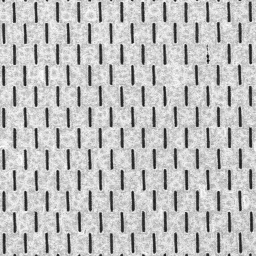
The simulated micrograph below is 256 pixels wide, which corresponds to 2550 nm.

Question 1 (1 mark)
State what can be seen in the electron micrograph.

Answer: a regular array of holes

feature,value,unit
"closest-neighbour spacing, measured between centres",0.212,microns